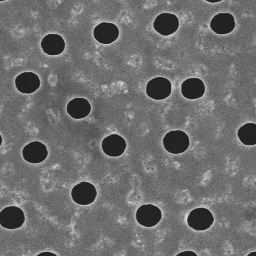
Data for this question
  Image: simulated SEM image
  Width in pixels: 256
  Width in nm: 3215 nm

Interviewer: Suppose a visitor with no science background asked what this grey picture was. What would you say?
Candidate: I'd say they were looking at a regular array of holes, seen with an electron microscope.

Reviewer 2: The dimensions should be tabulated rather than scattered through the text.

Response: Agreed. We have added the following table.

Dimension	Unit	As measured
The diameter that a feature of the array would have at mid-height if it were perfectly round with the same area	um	0.292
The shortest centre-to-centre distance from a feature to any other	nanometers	650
